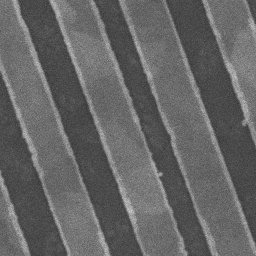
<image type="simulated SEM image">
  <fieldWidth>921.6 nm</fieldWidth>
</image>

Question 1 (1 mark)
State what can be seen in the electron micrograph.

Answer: one or a few lines or trenches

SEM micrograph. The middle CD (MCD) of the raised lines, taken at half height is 39.7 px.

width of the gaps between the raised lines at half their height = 0.118 um